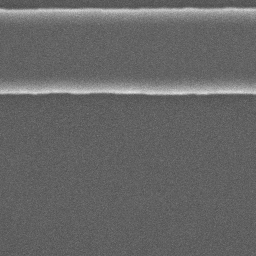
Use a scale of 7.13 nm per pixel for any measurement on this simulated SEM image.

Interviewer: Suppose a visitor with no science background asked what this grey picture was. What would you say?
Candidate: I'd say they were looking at lines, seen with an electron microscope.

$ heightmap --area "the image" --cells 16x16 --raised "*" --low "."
****************
****************
****************
****************
****************
****************
................
................
................
................
................
................
................
................
................
................